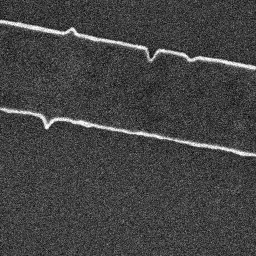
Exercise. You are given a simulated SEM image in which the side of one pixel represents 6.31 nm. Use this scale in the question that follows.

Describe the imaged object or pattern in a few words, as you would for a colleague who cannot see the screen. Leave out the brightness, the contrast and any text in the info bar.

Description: one or a few lines or trenches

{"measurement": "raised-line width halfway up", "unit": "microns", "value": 0.544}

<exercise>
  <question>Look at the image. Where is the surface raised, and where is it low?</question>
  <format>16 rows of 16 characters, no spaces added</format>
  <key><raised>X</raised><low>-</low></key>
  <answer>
----------------
X---------------
XXXXXX----------
XXXXXXXXXXX-----
XXXXXXXXXXXXXXXX
XXXXXXXXXXXXXXXX
XXXXXXXXXXXXXXXX
---XXXXXXXXXXXXX
----------XXXXXX
---------------X
----------------
----------------
----------------
----------------
----------------
----------------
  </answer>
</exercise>